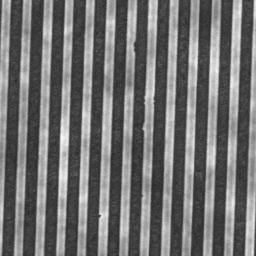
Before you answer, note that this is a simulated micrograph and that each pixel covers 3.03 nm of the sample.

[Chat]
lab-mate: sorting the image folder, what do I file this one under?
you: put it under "parallel lines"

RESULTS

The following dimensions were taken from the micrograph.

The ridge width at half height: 25.3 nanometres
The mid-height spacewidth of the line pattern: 39.7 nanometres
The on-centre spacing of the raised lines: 63.5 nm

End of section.